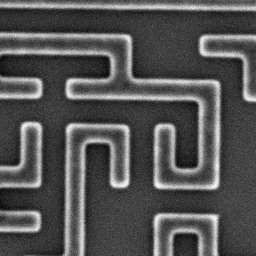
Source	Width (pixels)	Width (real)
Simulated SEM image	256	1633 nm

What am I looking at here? wiring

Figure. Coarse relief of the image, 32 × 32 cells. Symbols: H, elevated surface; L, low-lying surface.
HHHHHHHHHHHHHHHHHHHHHHHHHHHHHHHH
LLLLLLLLLLLLLLLLLLLLLLLLLLLLLLLL
LLLLLLLLLLLLLLLLLLLLLLLLLLLLLLLL
LLLLLLLLLLLLLLLLLLLLLLLLLLLLLLLL
HHHHHHHHHHHHHHHHLLLLLLLLLLLLLLLL
HHHHHHHHHHHHHHHHLLLLLLLLLHHHHHHH
HHHHHHHHHHHHHHHHLLLLLLLLLHHHHHHH
LLLLLLLLLLLLLLHHLLLLLLLLLLLLLLHH
LLLLLLLLLLLLLLHHLLLLLLLLLLLLLLLH
LLLLLLLLLLLLLLHHHLLLLLLLLLLLLLLH
HHHHHLLLHHHHHHHHHHHHHHHHHHHLLLLH
HHHHHLLLHHHHHHHHHHHHHHHHHHHLLLLH
LLLLLLLLLLLLLLLLLLLLLLLLHHHLLLLH
LLLLLLLLLLLLLLLLLLLLLLLLLHHLLLLL
LLLLLLLLLLLLLLLLLLLLLLLLLHHLLLLL
LLLHHLLLLLLLLLLLLLLLLLLLLHHLLLLL
LLLHHLLLHHHHHHHHLLLHHHLLLHHLLLLL
LLLHHLLLHHHHHHHHLLLHHHLLLHHLLLLL
LLLHHLLLHHHLLLHHLLLHHHLLLHHLLLLL
LLLHHLLLHHLLLLHHLLLHHHLLLHHLLLLL
LLHHHLLLHHLLLLHHLLLHHHLLLHHLLLLL
HHHHHLLLHHLLLLHHLLLHHHHHHHHLLLLL
HHHHHLLLHHLLLLHHLLLHHHHHHHHLLLLL
LLLLLLLLHHLLLLLLLLLLLHHHHHHLLLLL
LLLLLLLLHHLLLLLLLLLLLLLLLLLLLLLL
LLLLLLLLHHLLLLLLLLLLLLLLLLLLLLLL
HHHHLLLLHHLLLLLLLLLLLLLLLLLLLLLL
HHHHHLLLHHLLLLLLLLLHHHHHHHHLLLLL
HHHHHLLLHHLLLLLLLLLHHHHHHHHLLLLL
LLLLLLLLHHLLLLLLLLLHHHLLLHHLLLLL
LLLLLLLLHHLLLLLLLLLHHHLLLHHLLLLL
LLLLLLLLHHLLLLLLLLLHHLLLLHHLLLLL